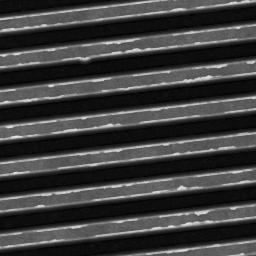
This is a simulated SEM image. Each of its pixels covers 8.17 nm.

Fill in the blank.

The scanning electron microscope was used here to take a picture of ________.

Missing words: parallel lines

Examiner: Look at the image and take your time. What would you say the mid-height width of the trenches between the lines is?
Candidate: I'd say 142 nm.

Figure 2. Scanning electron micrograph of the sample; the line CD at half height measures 150 nm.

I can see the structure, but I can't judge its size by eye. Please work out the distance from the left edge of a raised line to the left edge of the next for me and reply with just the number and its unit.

292 nanometers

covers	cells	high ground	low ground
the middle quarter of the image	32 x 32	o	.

................................
......................oooooooooo
...............ooooooooooooooooo
.....ooooooooooooooooooooooooooo
oooooooooooooooooooooooooooooooo
oooooooooooooooooooooooooooo....
ooooooooooooooooooo.............
ooooooooooo.....................
oo..............................
...............................o
......................o.oooooooo
..............oooooooooooooooooo
.....ooooooooooooooooooooooooooo
oooooooooooooooooooooooooooooooo
oooooooooooooooooooooooooooo....
ooooooooooooooooooo.............
ooooooooooo.....................
ooo.............................
................................
......................oooooooooo
..............oooooooooooooooooo
.......ooooooooooooooooooooooooo
oooooooooooooooooooooooooooooooo
oooooooooooooooooooooooooooo....
ooooooooooooooooooo.............
oooooooooo......................
ooo.............................
................................
......................oooooooooo
................oooooooooooooooo
.......ooooooooooooooooooooooooo
oooooooooooooooooooooooooooooooo